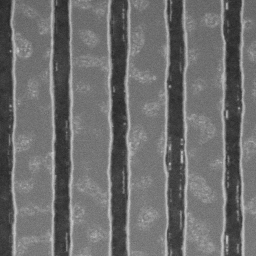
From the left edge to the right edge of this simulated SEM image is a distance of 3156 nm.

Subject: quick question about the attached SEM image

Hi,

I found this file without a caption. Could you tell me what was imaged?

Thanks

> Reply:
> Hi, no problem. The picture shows parallel lines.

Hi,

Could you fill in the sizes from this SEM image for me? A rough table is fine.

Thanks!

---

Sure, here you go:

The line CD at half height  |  499 nm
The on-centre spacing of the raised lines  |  0.704 microns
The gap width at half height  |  0.205 micrometres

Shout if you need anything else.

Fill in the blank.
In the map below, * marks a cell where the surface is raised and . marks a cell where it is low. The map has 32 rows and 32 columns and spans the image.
..*****..*****..*****..*****..**
..*****..*****..*****..*****..**
.******..*****..*****..*****..**
.******..*****..*****..*****..**
..*****..*****..*****..*****..**
..*****..*****..*****..*****..**
..*****..*****..*****..*****..**
..****...*****..*****..*****..**
..****...*****..*****..*****..**
..****...*****..*****..*****..**
..****...*****..*****..*****..**
..*****..*****..*****..*****..**
..*****..*****..*****..*****..**
..*****..*****..*****..*****..**
..*****..*****..*****..*****..**
..*****..*****..*****..*****..**
..*****..*****..*****..*****..**
..*****..*****..*****..*****..**
..*****..*****..*****..*****..**
..*****..*****..*****..*****..**
..*****..*****..*****..*****..**
..*****..*****..*****..*****..**
..*****..*****..*****..*****..**
..*****..*****..*****..*****..**
..*****..*****..*****..*****..**
..*****..*****..*****..*****..**
..*****..*****..*****..*****..**
..*****..*****..*****..*****..**
..*****..*****..*****..*****..**
..*****..*****..*****..*****..**
..*****..*****..*****..*****..**
..*****..*****..*****..*****..**